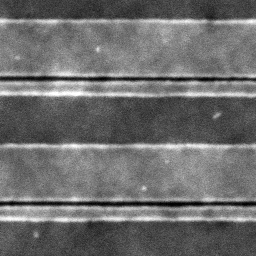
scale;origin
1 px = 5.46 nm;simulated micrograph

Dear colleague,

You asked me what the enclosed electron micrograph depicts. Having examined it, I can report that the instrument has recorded lines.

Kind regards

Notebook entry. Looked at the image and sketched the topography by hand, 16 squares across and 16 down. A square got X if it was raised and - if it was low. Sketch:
----------------
XXXXXXXXXXXXXXXX
XXXXXXXXXXXXXXXX
XXXXXXXXXXXXXXXX
XXXXXXXXXXXXXXXX
XXXXXXXXXXXXXXXX
----------------
----------------
----------------
XXXXXXXXXXXXXXXX
XXXXXXXXXXXXXXXX
XXXXXXXXXXXXXXXX
XXXXXXXXXXXXXXXX
XXXXXXXXXXXXXXXX
----------------
----------------